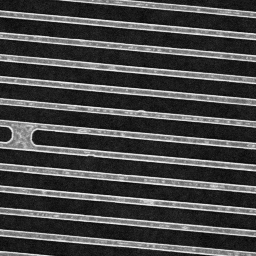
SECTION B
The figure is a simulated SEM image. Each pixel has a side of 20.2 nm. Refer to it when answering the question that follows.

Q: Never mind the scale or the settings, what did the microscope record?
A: parallel lines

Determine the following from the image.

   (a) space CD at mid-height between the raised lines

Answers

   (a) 330 nanometres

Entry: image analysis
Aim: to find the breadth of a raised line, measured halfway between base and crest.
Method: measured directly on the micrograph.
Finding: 106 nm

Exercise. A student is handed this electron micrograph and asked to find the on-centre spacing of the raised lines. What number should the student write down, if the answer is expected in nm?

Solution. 441